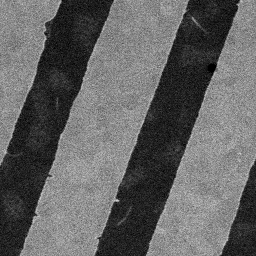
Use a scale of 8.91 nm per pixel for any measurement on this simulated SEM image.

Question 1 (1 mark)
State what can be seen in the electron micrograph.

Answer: one or a few lines or trenches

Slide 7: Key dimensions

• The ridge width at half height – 626 nm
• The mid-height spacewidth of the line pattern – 0.429 microns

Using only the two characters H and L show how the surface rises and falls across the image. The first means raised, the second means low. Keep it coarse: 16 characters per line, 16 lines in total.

HHHHLLLHHHHHLLLH
HHHLLLLHHHHLLLLH
HHHLLLHHHHHLLLHH
HHHLLLHHHHHLLLHH
HHLLLHHHHHLLLHHH
HHLLLHHHHHLLLHHH
HLLLLHHHHLLLLHHH
HLLLHHHHHLLLHHHH
HLLLHHHHHLLLHHHH
LLLLHHHHLLLLHHHH
LLLHHHHHLLLHHHHH
LLLHHHHHLLLHHHHL
LLHHHHHLLLHHHHHL
LLHHHHHLLLHHHHHL
LLHHHHLLLLHHHHLL
LHHHHHLLLHHHHHLL